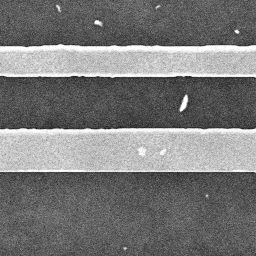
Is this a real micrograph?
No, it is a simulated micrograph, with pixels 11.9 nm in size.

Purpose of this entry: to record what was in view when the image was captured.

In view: lines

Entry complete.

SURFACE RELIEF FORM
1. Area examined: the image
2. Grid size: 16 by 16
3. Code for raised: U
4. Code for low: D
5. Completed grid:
DDDDDDDDDDDDDDDD
DDDDDDDDDDDDDDDD
DDDDDDDDDDDDDDDD
UUUUUUUUUUUUUUUU
UUUUUUUUUUUUUUUU
DDDDDDDDDDDDDDDD
DDDDDDDDDDDDDDDD
DDDDDDDDDDDDDDDD
UUUUUUUUUUUUUUUU
UUUUUUUUUUUUUUUU
UUUUUUUUUUUUUUUU
DDDDDDDDDDDDDDDD
DDDDDDDDDDDDDDDD
DDDDDDDDDDDDDDDD
DDDDDDDDDDDDDDDD
DDDDDDDDDDDDDDDD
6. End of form